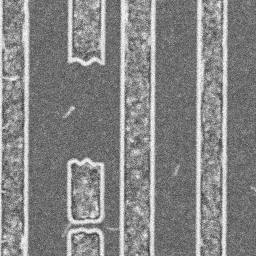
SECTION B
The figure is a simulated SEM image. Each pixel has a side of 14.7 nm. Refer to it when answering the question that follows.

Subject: one or a few lines or trenches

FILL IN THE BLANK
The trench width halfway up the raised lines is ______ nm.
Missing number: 383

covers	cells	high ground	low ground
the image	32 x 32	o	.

...oooooo....oo....oooooo...oooo
...oooooo....oo....oooooo...oooo
...oooooo....oo....oooooo...oooo
...oooooo....oo....oooooo...oooo
...oooooo....oo....oooooo...oooo
...oooooo....oo....oooooo...oooo
...oooooo....oo....oooooo...oooo
...ooooooo..ooo....oooooo...oooo
...oooooooooooo....oooooo...oooo
...oooooooooooo....oooooo...oooo
...oooooooooooo....oooooo...oooo
...oooooooooooo....oooooo...oooo
...oooooooooooo....oooooo...oooo
...oooooooooooo....oooooo...oooo
...oooooooooooo....oooooo...oooo
...oooooooooooo....oooooo...oooo
...oooooooooooo....oooooo...oooo
...oooooooooooo....oooooo...oooo
...oooooooooooo....oooooo...oooo
...oooooooooooo....oooooo...oooo
...oooooo...ooo....oooooo...oooo
...oooooo....oo....oooooo...oooo
...oooooo....oo....oooooo...oooo
...oooooo....oo....oooooo...oooo
...oooooo....oo....oooooo...oooo
...oooooo....oo....oooooo...oooo
...oooooo....oo....oooooo...oooo
...oooooo...ooo....oooooo...oooo
...oooooooooooo....oooooo...oooo
...oooooo....oo....oooooo...oooo
...oooooo....oo....oooooo...oooo
...oooooo....oo....oooooo...oooo